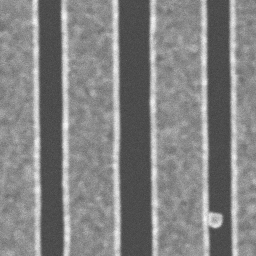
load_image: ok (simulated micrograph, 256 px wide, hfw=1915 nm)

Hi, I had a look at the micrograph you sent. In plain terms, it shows wiring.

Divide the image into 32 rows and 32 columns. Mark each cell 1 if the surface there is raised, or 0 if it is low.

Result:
11110000111111000001111110000111
11110000111111000001111110000111
11110000111111000001111111000111
11110000111111000001111111000111
11110000111111000001111111000111
11110000111111000001111111000111
11110000111111000001111111000111
11110000111111000001111111000111
11110000111111000001111111000111
11110000111111000001111111000111
11110000111111000001111111000111
11110000111111000001111111000111
11110000111111000001111111000111
11110000111111100001111111000111
11110000111111100001111111000111
11111000111111100001111111000111
11111000111111100001111111000111
11111000111111100001111111000111
11111000111111100001111111000111
11111000111111000001111111000111
11111000111111000001111111000111
11111000111111100001111111000111
11111000111111100001111111000111
11111000111111100001111111000111
11111000111111100001111111000111
11111000111111100001111111000111
11111000111111100001111111000111
11111000111111100001111111000111
11111000111111100001111111000111
11111000111111100001111111000111
11111000111111100001111111000111
11111000111111100001111111000111